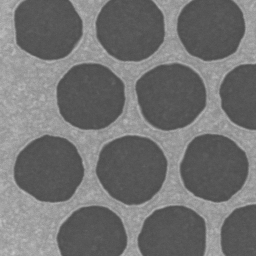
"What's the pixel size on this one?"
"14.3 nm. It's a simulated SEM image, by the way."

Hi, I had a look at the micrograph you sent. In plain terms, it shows holes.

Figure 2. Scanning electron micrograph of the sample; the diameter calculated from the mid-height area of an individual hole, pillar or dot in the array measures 0.981 micrometres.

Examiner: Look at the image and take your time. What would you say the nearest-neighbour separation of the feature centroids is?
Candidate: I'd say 1170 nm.